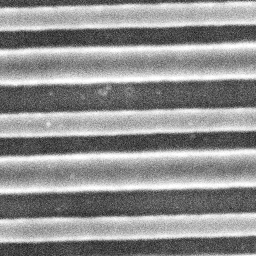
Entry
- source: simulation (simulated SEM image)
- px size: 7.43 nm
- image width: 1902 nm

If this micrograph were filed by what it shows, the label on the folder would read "lines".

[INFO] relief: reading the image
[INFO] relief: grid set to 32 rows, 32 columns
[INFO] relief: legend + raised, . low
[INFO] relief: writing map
..........................++++++
++++++++++++++++++++++++++++++++
++++++++++++++++++++++++++++++++
+++++++++.......................
................................
................................
.+++++++++++++++++++++++++++++++
++++++++++++++++++++++++++++++++
++++++++++++++++++++++++++++++++
+++++++++++++++++++++++++++++.++
................................
................................
................................
................................
++++++++++++++++++++++++++++++++
++++++++++++++++++++++++++++++++
+++++++++++++++++++.............
................................
................................
..............++++++++++++++++++
++++++++++++++++++++++++++++++++
++++++++++++++++++++++++++++++++
++++++++++++++++++++++++++++++++
+++++++++++++++.................
................................
................................
................................
..++++++++++++++++++++++++++++++
++++++++++++++++++++++++++++++++
+++++++++++++++++++++++++.+.....
................................
................................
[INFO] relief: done